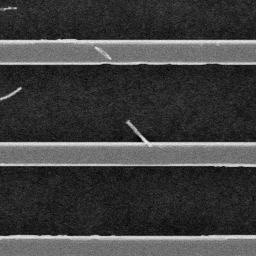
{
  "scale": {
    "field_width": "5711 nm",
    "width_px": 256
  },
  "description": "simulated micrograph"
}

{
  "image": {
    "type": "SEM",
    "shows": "lines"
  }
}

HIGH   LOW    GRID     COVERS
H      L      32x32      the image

LLLLLLLLLLLLLLLLLLLLLLLLLLLLLLLL
LLLLLLLLLLLLLLLLLLLLLLLLLLLLLLLL
LLLLLLLLLLLLLLLLLLLLLLLLLLLLLLLL
LLLLLLLLLLLLLLLLLLLLLLLLLLLLLLLL
LLLLLLLLLLLLLLLLLLLLLLLLLLLLLLLL
HHHHHHHHHHHHHHHHHHHHHHHHHHHHHHHH
HHHHHHHHHHHHHHHHHHHHHHHHHHHHHHHH
HHHHHHHHHHHHHHHHHHHHHHHHHHHHHHHH
LLLLLLLLLLLLLLLLLLLLLLLLLLLLLLLL
LLLLLLLLLLLLLLLLLLLLLLLLLLLLLLLL
LLLLLLLLLLLLLLLLLLLLLLLLLLLLLLLL
LLLLLLLLLLLLLLLLLLLLLLLLLLLLLLLL
LLLLLLLLLLLLLLLLLLLLLLLLLLLLLLLL
LLLLLLLLLLLLLLLLLLLLLLLLLLLLLLLL
LLLLLLLLLLLLLLLLLLLLLLLLLLLLLLLL
LLLLLLLLLLLLLLLLLLLLLLLLLLLLLLLL
LLLLLLLLLLLLLLLLLLLLLLLLLLLLLLLL
LLLLLLLLLLLLLLLLLLLLLLLLLLLLLLLL
HHHHHHHHHHHHHHHHHHHHHHHHHHHHHHHH
HHHHHHHHHHHHHHHHHHHHHHHHHHHHHHHH
HHHHHHHHHHHHHHHHHHHHHHHHHHHHHHHH
LLLLLLLLLLLLLLLLLLLLLLLLLLLLLLLL
LLLLLLLLLLLLLLLLLLLLLLLLLLLLLLLL
LLLLLLLLLLLLLLLLLLLLLLLLLLLLLLLL
LLLLLLLLLLLLLLLLLLLLLLLLLLLLLLLL
LLLLLLLLLLLLLLLLLLLLLLLLLLLLLLLL
LLLLLLLLLLLLLLLLLLLLLLLLLLLLLLLL
LLLLLLLLLLLLLLLLLLLLLLLLLLLLLLLL
LLLLLLLLLLLLLLLLLLLLLLLLLLLLLLLL
LLLLLLLLLLLLLLLLLLLLLLLLLLLLLHLH
HHHHHHHHHHHHHHHHHHHHHHHHHHHHHHHH
HHHHHHHHHHHHHHHHHHHHHHHHHHHHHHHH